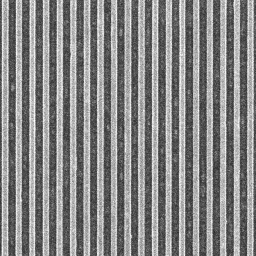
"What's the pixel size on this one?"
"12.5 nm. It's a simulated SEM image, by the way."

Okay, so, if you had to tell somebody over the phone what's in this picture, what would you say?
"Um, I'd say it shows parallel lines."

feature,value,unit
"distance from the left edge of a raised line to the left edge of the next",170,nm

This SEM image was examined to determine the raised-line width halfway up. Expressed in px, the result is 5.75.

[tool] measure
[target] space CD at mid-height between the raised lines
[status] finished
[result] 98.5 nm